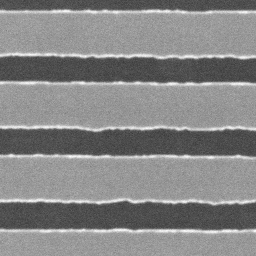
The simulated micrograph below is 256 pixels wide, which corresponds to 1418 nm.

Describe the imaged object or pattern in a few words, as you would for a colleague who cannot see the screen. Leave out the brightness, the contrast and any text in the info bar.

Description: lines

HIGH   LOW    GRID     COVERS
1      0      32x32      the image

00000000000000000000000000000000
11111111111111111111111100111111
11111111111111111111111111111111
11111111111111111111111111111111
11111111111111111111111111111111
11111111111111111111111111111111
11111111111111111111111111111111
00000000000000000000000000000000
00000000000000000000000000000000
00000000000000000000000000000000
11111111111111111111111111111111
11111111111111111111111111111111
11111111111111111111111111111111
11111111111111111111111111111111
11111111111111111111111111111111
11111111111111111111111111111111
00000000000000000000000000000000
00000000000000000000000000000000
00000000000000000000000000000000
11111111111111000111111100000100
11111111111111111111111111111111
11111111111111111111111111111111
11111111111111111111111111111111
11111111111111111111111111111111
11111111111111111111111111111111
00000000000000000000000000100000
00000000000000000000000000000000
00000000000000000000000000000000
00000000000000000000000000000000
11111111111111111111111111111111
11111111111111111111111111111111
11111111111111111111111111111111